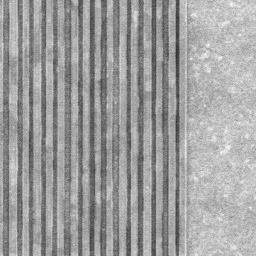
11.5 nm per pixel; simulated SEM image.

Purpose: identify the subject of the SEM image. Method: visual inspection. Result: parallel lines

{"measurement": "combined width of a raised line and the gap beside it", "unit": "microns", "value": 0.14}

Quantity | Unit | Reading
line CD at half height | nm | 71.9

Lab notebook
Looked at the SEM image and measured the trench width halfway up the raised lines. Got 71.9 nm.